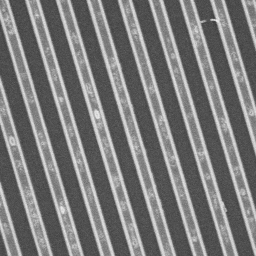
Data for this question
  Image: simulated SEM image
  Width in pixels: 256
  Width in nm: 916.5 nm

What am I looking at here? parallel lines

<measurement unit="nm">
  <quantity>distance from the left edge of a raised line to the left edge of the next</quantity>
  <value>106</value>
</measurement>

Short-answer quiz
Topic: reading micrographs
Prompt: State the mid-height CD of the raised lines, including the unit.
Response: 43.3 nm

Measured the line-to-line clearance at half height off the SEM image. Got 63.5 nm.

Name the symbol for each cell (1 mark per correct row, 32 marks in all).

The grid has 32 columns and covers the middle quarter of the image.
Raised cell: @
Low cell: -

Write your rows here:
---@@@-----@@@-----@@@----@@@---
---@@@@----@@@-----@@@----@@@@--
----@@@----@@@-----@@@-----@@@--
----@@@-----@@@-----@@-----@@@--
----@@@-----@@@-----@@@----@@@--
-----@@@----@@@-----@@@-----@@@-
-----@@@-----@@@----@@@-----@@@-
@----@@@-----@@@-----@@@----@@@-
@----@@@@----@@@-----@@@-----@@@
@-----@@@-----@@-----@@@-----@@@
@-----@@@-----@@@-----@@-----@@@
@@----@@@-----@@@-----@@@-----@@
@@-----@@@----@@@-----@@@-----@@
@@-----@@@-----@@@----@@@-----@@
@@@----@@@-----@@@-----@@@-----@
@@@-----@@-----@@@-----@@@-----@
@@@-----@@@-----@@-----@@@-----@
@@@-----@@@-----@@@-----@@@----@
-@@@----@@@-----@@@-----@@@----@
-@@@-----@@@----@@@-----@@@-----
-@@@-----@@@-----@@@-----@@-----
--@@@----@@@-----@@@-----@@@----
--@@@-----@@@----@@@-----@@@----
--@@@-----@@@-----@@@----@@@----
--@@@@----@@@-----@@@-----@@@---
---@@@----@@@@----@@@-----@@@---
---@@@-----@@@-----@@-----@@@---
---@@@-----@@@-----@@@-----@@---
----@@@----@@@@----@@@-----@@@--
----@@@-----@@@----@@@-----@@@--
----@@@-----@@@-----@@@----@@@--
----@@@@----@@@-----@@@-----@@@-